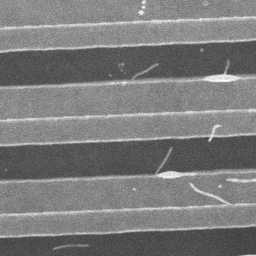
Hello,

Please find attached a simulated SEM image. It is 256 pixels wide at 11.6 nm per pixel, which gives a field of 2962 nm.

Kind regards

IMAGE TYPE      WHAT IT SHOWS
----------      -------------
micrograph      lines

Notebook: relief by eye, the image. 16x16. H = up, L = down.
HHHHHHHHHHHHHHHH
HHHHHHHHHHHHHHHH
HHHHHHHHHHHHHHHH
LLLLLLLLLLLLLLLL
LLLLLLLLLLLLLLLL
LHHHHHHHHHHHHHHH
HHHHHHHHHHHHHHHH
HHHHHHHHHHHHHHHH
HHHHHHHHHHHHHHLL
LLLLLLLLLLLLLLLL
LLLLLLLLLLLLLLLL
HHHHHHHHHHHHHHHH
HHHHHHHHHHHHHHHH
HHHHHHHHHHHHHHHH
HHHHHHHHLLLLLLLL
LLLLLLLLLLLLLLLL